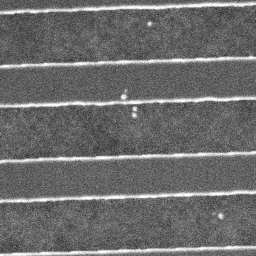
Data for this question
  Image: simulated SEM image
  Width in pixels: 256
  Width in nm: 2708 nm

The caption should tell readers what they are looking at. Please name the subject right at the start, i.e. lines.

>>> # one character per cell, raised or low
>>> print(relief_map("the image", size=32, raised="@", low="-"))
@@@@@@@@@@@@@@@@@@@@@@@@@@@@@@@@
@@@-@---------------------------
--------------------------------
--------------------------------
--------------------------------
--------------------------------
--------------------------------
---------------------@@@@@@@@@@@
@@@@@@@@@@@@@@@@@@@@@@@@@@@@@@@@
@@@@@@@@@@@@@@@@@@@@@@@@@@@@@@@@
@@@@@@@@@@@@@@@@@@@@@@@@@@@@@@@@
@@@@@@@@@@@@@@@@@@@@@@@@@@@@@@@@
@@@@@@@@@@@@@@@@@@@@@@@@@--@@---
--------------------------------
--------------------------------
--------------------------------
--------------------------------
--------------------------------
--------------------------------
------------------@@@@@@@@@@@@@@
@@@@@@@@@@@@@@@@@@@@@@@@@@@@@@@@
@@@@@@@@@@@@@@@@@@@@@@@@@@@@@@@@
@@@@@@@@@@@@@@@@@@@@@@@@@@@@@@@@
@@@@@@@@@@@@@@@@@@@@@@@@@@@@@@@@
@@@@@@@@@@@@@@@@@@@@@-----------
--------------------------------
--------------------------------
--------------------------------
--------------------------------
--------------------------------
--------------------------------
------------@@@@@@@@@@@@@@@@@@@@